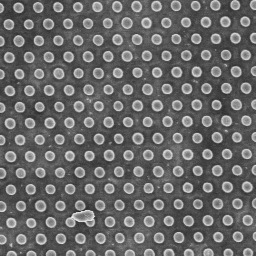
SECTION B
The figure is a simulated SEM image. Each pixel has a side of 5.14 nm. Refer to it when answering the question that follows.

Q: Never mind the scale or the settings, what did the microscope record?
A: a regular array of raised bodies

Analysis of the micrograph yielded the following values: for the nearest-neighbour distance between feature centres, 0.0971 microns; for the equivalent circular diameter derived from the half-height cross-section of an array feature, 51.6 nanometers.